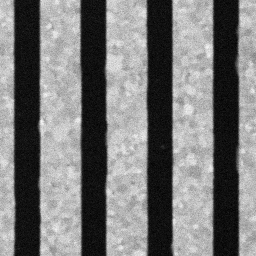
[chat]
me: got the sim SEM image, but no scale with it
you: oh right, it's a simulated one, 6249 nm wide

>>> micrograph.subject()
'lines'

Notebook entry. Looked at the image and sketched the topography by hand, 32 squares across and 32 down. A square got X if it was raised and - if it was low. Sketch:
XX---XXXXX---XXXXX----XXXXX---XX
XX---XXXXX---XXXXX----XXXXX---XX
XX---XXXXX---XXXXX----XXXXX---XX
XX---XXXXX---XXXXX----XXXXX---XX
XX---XXXXX---XXXXX----XXXXX---XX
XX---XXXXX---XXXXX----XXXXX---XX
XX---XXXXX---XXXXX----XXXXX---XX
XX---XXXXX---XXXXX----XXXXX---XX
XX---XXXXX---XXXXX----XXXXX---XX
XX---XXXXX---XXXXX----XXXXX---XX
XX---XXXXX---XXXXX----XXXXX---XX
XX---XXXXX---XXXXX----XXXXX---XX
XX---XXXXX---XXXXX----XXXXX---XX
XX---XXXXX---XXXXX----XXXXX---XX
XX---XXXXX---XXXXX----XXXXX---XX
XX---XXXXX---XXXXX----XXXXX---XX
XX---XXXXX---XXXXX----XXXXX---XX
XX---XXXXX---XXXXX----XXXXX---XX
XX---XXXXX---XXXXX----XXXXX---XX
XX---XXXXX---XXXXX----XXXXX---XX
XX---XXXXX---XXXXX----XXXXX---XX
XX---XXXXX---XXXXX----XXXXX---XX
XX---XXXXX---XXXXX----XXXXX---XX
XX---XXXXX---XXXXX----XXXXX---XX
XX---XXXXX---XXXXX----XXXXX---XX
XX---XXXXX---XXXXX----XXXXX---XX
XX---XXXXX---XXXXX----XXXXX---XX
XX---XXXXX---XXXXX----XXXXX---XX
XX---XXXXX---XXXXX----XXXXX---XX
XX---XXXXX---XXXXX----XXXXX---XX
XX---XXXXX---XXXXX----XXXXX---XX
XX---XXXXX---XXXXX----XXXXX---XX